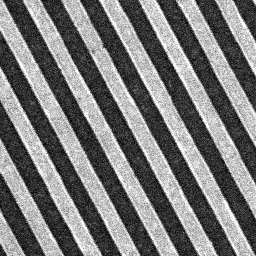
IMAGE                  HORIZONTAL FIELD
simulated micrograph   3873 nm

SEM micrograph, parallel lines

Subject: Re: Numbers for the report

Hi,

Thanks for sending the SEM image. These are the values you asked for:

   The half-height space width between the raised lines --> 293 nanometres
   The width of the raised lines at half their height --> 0.22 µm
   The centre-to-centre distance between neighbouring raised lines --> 511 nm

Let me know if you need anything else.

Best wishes